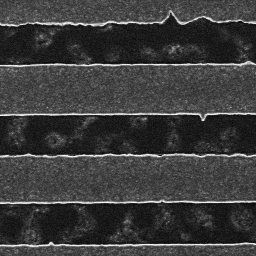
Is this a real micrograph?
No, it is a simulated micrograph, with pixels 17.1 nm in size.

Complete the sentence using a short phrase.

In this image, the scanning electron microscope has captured one or a few lines or trenches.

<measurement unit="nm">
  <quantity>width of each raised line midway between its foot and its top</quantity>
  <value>840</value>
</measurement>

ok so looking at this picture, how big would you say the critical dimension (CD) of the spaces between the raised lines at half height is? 708 nm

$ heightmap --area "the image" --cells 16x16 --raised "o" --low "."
oooooooooooooooo
oo.oooo.........
................
................
oooooooooooooooo
oooooooooooooooo
oooooooooooooooo
................
................
................
oooooooooooooooo
oooooooooooooooo
oooooooooooooooo
................
................
oooooooooooooooo